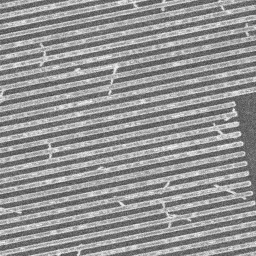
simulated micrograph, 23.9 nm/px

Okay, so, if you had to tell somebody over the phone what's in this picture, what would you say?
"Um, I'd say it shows parallel lines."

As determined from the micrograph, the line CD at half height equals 99.5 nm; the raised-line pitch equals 0.241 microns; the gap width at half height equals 138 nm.